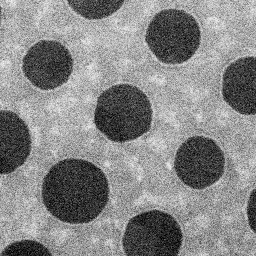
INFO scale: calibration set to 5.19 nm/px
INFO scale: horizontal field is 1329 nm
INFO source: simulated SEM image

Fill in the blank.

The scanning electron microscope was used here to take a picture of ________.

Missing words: raised bodies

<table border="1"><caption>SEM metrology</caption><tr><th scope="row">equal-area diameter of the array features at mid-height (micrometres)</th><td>0.302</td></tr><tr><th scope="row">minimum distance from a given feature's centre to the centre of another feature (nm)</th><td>472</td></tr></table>